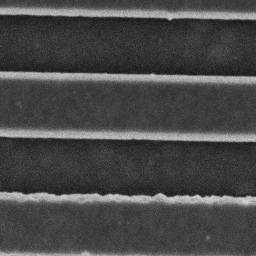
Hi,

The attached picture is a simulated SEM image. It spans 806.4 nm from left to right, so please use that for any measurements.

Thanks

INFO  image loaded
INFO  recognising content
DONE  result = one or a few lines or trenches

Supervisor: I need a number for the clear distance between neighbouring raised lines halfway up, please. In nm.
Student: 195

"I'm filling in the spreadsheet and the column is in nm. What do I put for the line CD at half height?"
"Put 190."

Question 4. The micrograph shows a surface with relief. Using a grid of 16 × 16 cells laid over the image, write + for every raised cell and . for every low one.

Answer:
++++++++++++++++
................
................
................
................
++++++++++++++++
++++++++++++++++
++++++++++++++++
......++++++++++
................
................
................
++++++++++++++++
++++++++++++++++
++++++++++++++++
++++++++++++++++